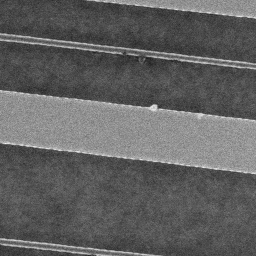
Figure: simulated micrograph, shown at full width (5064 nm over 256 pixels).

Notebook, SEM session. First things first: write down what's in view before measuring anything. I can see lines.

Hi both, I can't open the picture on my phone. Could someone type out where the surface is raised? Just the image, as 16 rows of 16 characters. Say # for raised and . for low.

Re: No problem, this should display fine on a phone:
..........######
................
................
........#.......
................
................
#######.........
################
################
.....###########
.............###
................
................
................
................
................